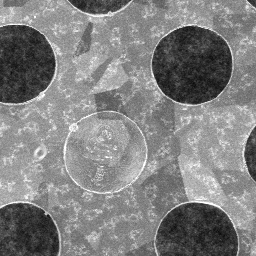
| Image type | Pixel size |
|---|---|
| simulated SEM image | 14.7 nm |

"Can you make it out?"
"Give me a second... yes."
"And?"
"holes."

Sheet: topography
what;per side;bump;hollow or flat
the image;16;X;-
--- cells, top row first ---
XXXXX---XXXXXXXX
XXXXXXXXXXXXXXXX
---XXXXXXX----XX
---XXXXXXX----XX
---XXXXXXX----XX
---XXXXXXX----XX
XXXXXXXXXXXXXXXX
XXXXXXXXXXXXXXXX
XXXXXXXXXXXXXXXX
XXXXXXXXXXXXXXX-
XXXXXXXXXXXXXXX-
XXXXXXXXXXXXXXXX
XXXXXXXXXXXXXXXX
---XXXXXXX----XX
----XXXXXX-----X
----XXXXXX-----X